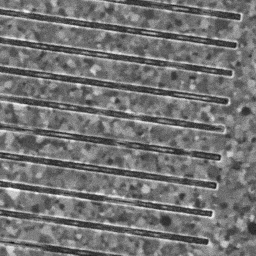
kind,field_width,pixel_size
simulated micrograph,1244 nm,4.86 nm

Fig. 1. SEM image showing parallel lines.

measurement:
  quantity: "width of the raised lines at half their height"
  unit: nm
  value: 104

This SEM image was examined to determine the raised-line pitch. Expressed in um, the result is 0.138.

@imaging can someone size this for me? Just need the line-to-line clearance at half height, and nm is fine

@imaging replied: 30.6